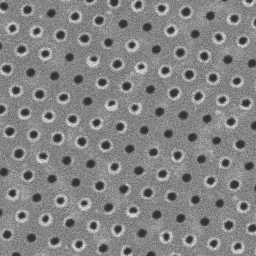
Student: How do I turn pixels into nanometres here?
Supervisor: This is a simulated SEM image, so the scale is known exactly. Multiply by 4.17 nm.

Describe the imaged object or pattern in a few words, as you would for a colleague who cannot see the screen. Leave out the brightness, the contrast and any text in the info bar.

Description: a regular array of holes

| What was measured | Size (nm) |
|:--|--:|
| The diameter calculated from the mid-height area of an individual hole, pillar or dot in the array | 34.6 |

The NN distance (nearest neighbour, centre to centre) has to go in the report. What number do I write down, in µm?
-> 0.0978